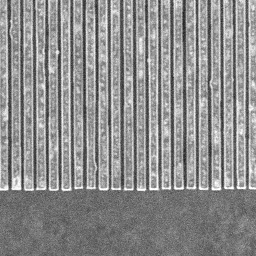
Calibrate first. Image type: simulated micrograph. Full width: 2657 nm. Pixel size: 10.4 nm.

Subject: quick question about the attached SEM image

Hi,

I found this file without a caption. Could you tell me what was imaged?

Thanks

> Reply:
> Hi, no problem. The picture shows parallel lines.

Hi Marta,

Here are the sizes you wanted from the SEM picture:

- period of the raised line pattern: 130 nm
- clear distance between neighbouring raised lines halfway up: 44.1 nanometers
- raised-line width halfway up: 7.62 pixels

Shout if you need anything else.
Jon